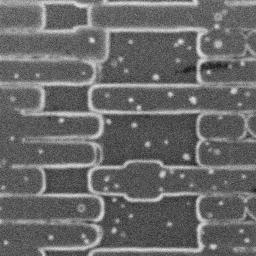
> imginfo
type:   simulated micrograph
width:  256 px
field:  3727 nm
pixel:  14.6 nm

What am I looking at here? wiring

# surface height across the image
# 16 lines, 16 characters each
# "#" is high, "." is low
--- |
###..###########
###..###########
#######.....####
######.......###
######......####
###...##########
###...##########
######......####
######......####
######......####
###...##########
###...##########
######..##..####
######.......###
######......####
######......####